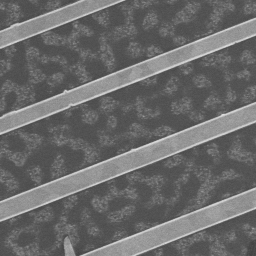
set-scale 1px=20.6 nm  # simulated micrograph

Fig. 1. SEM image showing one or a few lines or trenches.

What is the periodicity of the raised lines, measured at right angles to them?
80 px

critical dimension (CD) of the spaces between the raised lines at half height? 1.3 um